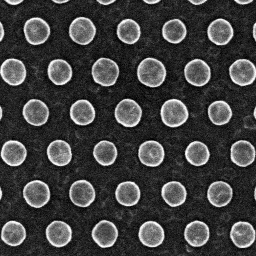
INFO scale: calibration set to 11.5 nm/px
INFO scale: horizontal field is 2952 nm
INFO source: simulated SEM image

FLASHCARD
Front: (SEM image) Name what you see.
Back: a regular array of raised bodies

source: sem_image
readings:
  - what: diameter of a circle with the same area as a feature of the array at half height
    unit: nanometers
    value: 291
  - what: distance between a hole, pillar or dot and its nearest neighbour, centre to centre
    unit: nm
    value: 526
